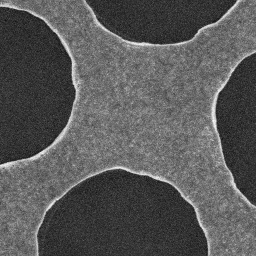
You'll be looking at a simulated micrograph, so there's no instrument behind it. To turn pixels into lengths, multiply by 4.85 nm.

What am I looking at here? holes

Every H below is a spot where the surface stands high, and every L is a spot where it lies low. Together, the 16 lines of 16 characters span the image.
LHHHHHLLLLLLLLHH
LLLHHHLLLLLLLHHH
LLLLHHHHLLLLHHHH
LLLLHHHHHHHHHHHH
LLLLHHHHHHHHHHHL
LLLLLHHHHHHHHHLL
LLLLLHHHHHHHHLLL
LLLLHHHHHHHHHLLL
LLLLHHHHHHHHHHLL
LLLHHHHHHHHHHHLL
HHHHHHHHHHHHHHLL
HHHHHLLLLLLHHHHL
HHHHLLLLLLLLHHHH
HHHLLLLLLLLLHHHH
HHLLLLLLLLLLLHHH
HHLLLLLLLLLLLHHH